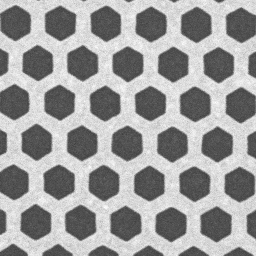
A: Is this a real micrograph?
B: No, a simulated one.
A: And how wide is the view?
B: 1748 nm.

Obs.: a regular array of holes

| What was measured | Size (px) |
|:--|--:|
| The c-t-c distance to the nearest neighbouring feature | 45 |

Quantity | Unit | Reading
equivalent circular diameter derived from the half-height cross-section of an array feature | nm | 225